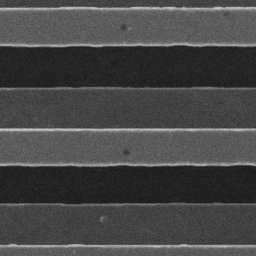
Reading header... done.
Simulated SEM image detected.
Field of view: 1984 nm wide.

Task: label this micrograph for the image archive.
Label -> lines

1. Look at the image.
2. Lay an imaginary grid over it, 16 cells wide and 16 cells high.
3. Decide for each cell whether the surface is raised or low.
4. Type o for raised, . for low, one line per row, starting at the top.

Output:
oooooooooooooooo
oooooooooooooooo
oooooooooooooooo
................
................
......o.....oo..
oooooooooooooooo
oooooooooooooooo
oooooooooooooooo
oooooooooooooooo
................
................
................
oooooooooooooooo
oooooooooooooooo
oooooooooooooooo